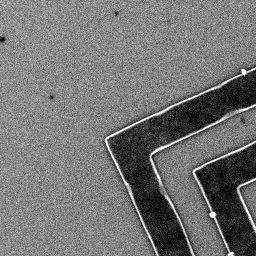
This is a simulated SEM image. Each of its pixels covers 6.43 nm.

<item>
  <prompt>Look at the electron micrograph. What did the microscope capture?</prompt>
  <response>groups of lines, slits or small figures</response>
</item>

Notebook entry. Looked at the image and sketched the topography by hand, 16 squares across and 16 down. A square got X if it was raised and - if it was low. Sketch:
----------------
----------------
----------------
----------------
---------------X
-------------XXX
-----------XXXXX
---------XXXXX--
-------XXXXX----
-------XXX-----X
-------XXX--XXXX
--------XX--XXX-
--------XXX--XX-
---------XX--XXX
---------XXX--XX
----------XX--XX